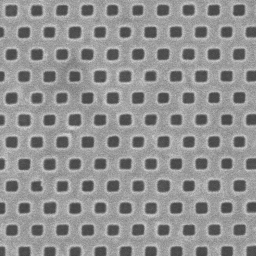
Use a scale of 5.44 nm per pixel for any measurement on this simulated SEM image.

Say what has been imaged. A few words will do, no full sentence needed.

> a regular array of holes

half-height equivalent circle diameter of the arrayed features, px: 12.9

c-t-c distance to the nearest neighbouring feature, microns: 0.136